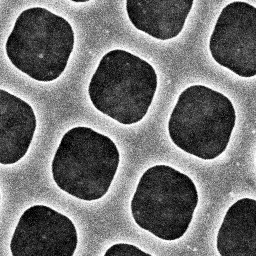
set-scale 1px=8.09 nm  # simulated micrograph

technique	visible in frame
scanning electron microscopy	holes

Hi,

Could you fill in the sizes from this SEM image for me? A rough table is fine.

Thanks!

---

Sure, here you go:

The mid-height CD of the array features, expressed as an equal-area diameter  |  0.566 µm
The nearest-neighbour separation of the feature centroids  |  699 nanometres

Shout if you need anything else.